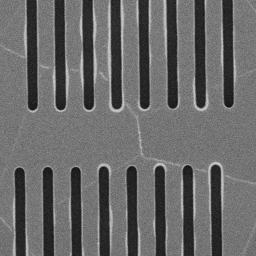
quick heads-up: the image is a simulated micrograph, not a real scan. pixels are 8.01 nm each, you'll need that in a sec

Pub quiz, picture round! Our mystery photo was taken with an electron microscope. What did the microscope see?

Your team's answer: groups of lines, slits or small figures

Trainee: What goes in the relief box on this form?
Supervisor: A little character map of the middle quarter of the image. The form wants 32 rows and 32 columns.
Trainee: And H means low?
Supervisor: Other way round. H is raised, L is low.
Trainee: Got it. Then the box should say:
LHHHLLLLHHHLLLLHHHHLLHHHHHLLLHHH
LHHHLLLLHHHLLLLHHHHLLHHHHHLLLHHH
LHHHLLLLHHHLLLLHHHHLLHHHHHLLLHHH
LHHHLLLLHHHHLLLHHHHLLHHHHHLLLHHH
LHHHLLLLHHHHLLLHHHHLLHHHHHLLLHHH
LHHHHLLLHHHHLLLHHHHLLLHHHHLLLHHH
LHHHHLLLHHHHLLLHHHHLLLHHHHLLLHHH
LHHHHLLLHHHHLLLHHHHLLLHHHHLLLHHH
LHHHHLLLHHHHLLLHHHHLLLHHHHLLLHHH
LHHHHLLLHHHHLLLHHHHLLLHHHHLLLHHH
LHHHHLLHHHHHLLLHHHHLLHHHHHLLLHHH
HHHHHHLHHHHHLLHHHHHHLHHHHHHHHHHH
HHHHHHHHHHHHHHHHHHHHHHHHHHHHHHHH
HHHHHHHHHHHHHHHHHHHHHHHHHHHHHHHH
HHHHHHHHHHHHHHHHHHHHHHHHHHHHHHHH
HHHHHHHHHHHHHHHHHHHHHHHHHHHHHHHH
HHHHHHHHHHHHHHHHHHHHHHHHHHHHHHHH
HHHHHHHHHHHHHHHHHHHHHHHHHHHHHHHH
HHHHHHHHHHHHHHHHHHHHHHHHHHHHHHHH
HHHHHHHHHHHHHHHHHHHHHHHHHHHHHHHH
HHHHHHHHHHHHHHHHHHHHHHHHHHHHHHHH
HHHHHHHHHHHHHHHHHHHHHHHHHHHHHHHH
HHHHHHHHHHHHHHHHHHHHHHHHHHHHHHHH
HHHHHHHHHHHHHHHHHHHHHHHHHHHHHHHH
HHHHHHHHHHHHHHHHHHHHHHHHHHHHHHHH
HHHHHHHHHLLHHHHHHHHHHHHLLHHHHHLL
HHLLHHHHHLLHHHHHLLHHHHLLLLHHHHLL
HLLLHHHHHLLLHHHLLLHHHHLLLHHHHLLL
HLLLHHHHHLLHHHHLLLHHHHLLLHHHHLLL
HLLLHHHHHLLHHHHLLLHHHHLLLHHHHLLL
HHLLHHHHHLLHHHHLLLHHHHLLLHHHHLLL
HHLLHHHHHLLHHHHHLLHHHHLLLHHHHLLL